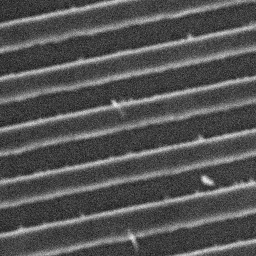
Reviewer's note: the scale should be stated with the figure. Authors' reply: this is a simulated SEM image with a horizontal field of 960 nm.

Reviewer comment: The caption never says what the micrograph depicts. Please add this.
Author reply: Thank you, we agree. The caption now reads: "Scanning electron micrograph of lines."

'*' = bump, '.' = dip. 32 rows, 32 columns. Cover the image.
............****************....
.......*****************........
..*****************.............
**************................**
********.................*******
****................************
...............***************..
...........**************.......
......***************...........
.***************................
***********................*****
*****.................**********
*................***************
............****************....
.......****************.........
...***************..............
*************.................**
********.................*******
****................************
...............****************.
...........***************......
......****************..........
.***************................
************................****
*******................*********
**................**************
.............******************.
.........*****************......
....******************..........
*****************...............
************.................***
*******.................********